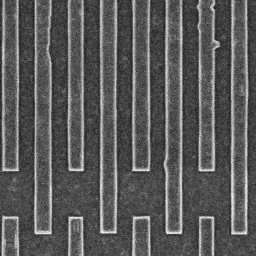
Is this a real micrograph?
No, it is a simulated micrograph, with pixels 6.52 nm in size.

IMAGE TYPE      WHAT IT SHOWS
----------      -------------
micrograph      parallel lines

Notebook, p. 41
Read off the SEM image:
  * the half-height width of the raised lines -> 96.2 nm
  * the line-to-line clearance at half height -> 114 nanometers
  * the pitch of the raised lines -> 213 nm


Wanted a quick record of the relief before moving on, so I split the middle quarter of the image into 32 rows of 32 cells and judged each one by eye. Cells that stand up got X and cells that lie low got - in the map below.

-XXXX----XXXX----XXXX-----XXX---
-XXXX----XXXX----XXXX-----XXX---
-XXXX----XXXX----XXXX-----XXX---
-XXXX----XXXX----XXXX-----XXX---
-XXXX----XXXX----XXXX-----XXX---
-XXXX----XXXX----XXXX-----XXX---
-XXXX----XXXX----XXXX-----XXX---
-XXXX----XXXX----XXXX-----XXX---
-XXXX----XXXX----XXXX-----XXX---
-XXXX----XXXX----XXXX-----XXX---
-XXXX----XXXX----XXXX-----XXX---
-XXXX----XXXX----XXXX-----XXX---
-XXXX----XXXX----XXXX-----XXX---
-XXXX----XXXX----XXXX-----XXX---
-XXXX----XXXX----XXXX-----XXX---
-XXXX----XXXX----XXXX-----XXX---
-XXXX----XXXX----XXXX-----XXX---
-XXXX----XXXX----XXXX-----XXX---
-XXXX----XXXX----XXXX-----XXX---
-XXXX----XXXX----XXXX-----XXX---
-XXXX----XXXX----XXXX-----XXX---
-XXXX----XXXX----XXXX-----XXX---
-XXXX----XXXX----XXXX-----XXX---
-XXXX----XXXX----XXXX----XXXX---
-XXXX----XXXX----XXXX----XXXX---
-XXXX----XXXX----XXXX----XXXX---
---------XXXX------------XXXX---
---------XXXX-------------XXX---
---------XXXX-------------XXX---
---------XXXX-------------XXX---
---------XXXX-------------XXX---
---------XXXX-------------XXX---